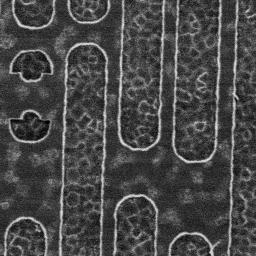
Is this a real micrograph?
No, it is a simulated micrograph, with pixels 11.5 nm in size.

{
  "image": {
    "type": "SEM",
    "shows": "parallel lines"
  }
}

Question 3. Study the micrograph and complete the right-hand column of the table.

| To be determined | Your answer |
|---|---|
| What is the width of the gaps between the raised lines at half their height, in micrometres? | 0.459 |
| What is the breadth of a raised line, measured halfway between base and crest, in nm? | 186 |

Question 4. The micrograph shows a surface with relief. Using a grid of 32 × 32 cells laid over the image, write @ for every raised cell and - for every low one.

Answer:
@@-----@@-----@-----@@------@@--
@@-----@@----@@-----@@------@@--
@@----@@@@--@@@-----@@-----@@@--
@@@@@@@@@@@@@@@-----@@-----@@@--
@@@@@@@@@@@@@@@-----@@-----@@@--
@@@@@@@@@@-@@@@-----@@-----@@@--
@@@--@@@@----@@-----@@-----@@---
@@----@@-----@@-----@@-----@@---
@-----@@-----@@-----@@-----@@---
@@@--@@@-----@@-----@@-----@@---
@@@@@@@@-----@@-----@@-----@@---
@@@@@@@@-----@@-----@@-----@@---
@@@@@@@@-----@@-----@@-----@@---
@@@@@@@@-----@@-----@@-----@@---
@@@--@@@-----@@-----@@-----@@---
@-----@@-----@@-----@@-----@@---
@-----@@-----@@-----@@-----@@---
@@---@@@-----@@-----@@-----@@---
@@@@@@@@-----@@@--@@@@-----@@---
@@@@@@@@-----@@@@@@@@@----@@@---
@@@@@@@@-----@@@@@@@@@@@@@@@@---
@@@@@@@@-----@@@@@@@@@@@@@@@@---
@@@@@@@@-----@@@@@@@@@@@@@@@@---
@@@@@@@@-----@@@@@@@@@@@@@@@@---
@@@@@@@@-----@@@@-@@@@@@@@@@@---
@@@@@@@@-----@@----@@@@@@@@@@---
@@@@@@@@-----@------@@@@@@@@@---
@@--@@@@-----@------@@@@@@@@@---
@----@@@-----@------@@@@@@@@@---
@-----@@-----@-----@@@---@@@@---
@-----@@-----@-----@@-----@@@---
@-----@@-----@-----@@-----@@@---